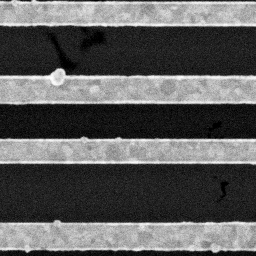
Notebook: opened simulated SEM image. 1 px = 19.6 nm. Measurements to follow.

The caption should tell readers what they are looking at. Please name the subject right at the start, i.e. lines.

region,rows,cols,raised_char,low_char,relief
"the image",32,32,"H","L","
HHHHHHHHHHHHHHHHHHHHHHHHHHHHHHHH
HHHHHHHHHHHHHHHHHHHHHHHHHHHHHHHH
HHHHHHHHHHHHHHHHHHHHHHHHHHHHHHHH
LLLLLLLLLLLLLLLLLLLLLLLLLLLLLLLL
LLLLLLLLLLLLLLLLLLLLLLLLLLLLLLLL
LLLLLLLLLLLLLLLLLLLLLLLLLLLLLLLL
LLLLLLLLLLLLLLLLLLLLLLLLLLLLLLLL
LLLLLLLLLLLLLLLLLLLLLLLLLLLLLLLL
LLLLLLLLLLLLLLLLLLLLLLLLLLLLLLLL
LLLLLLHHLLLLLLLLLLLLLLLLLLLLLLLL
HHHHHHHHHHHHHHHHHHHHHHHHHHHHHHHH
HHHHHHHHHHHHHHHHHHHHHHHHHHHHHHHH
HHHHHHHHHHHHHHHHHHHHHHHHHHHHHHHH
LLLLLLLLLLLLLLLLLLLLLLLLLLLLLLLL
LLLLLLLLLLLLLLLLLLLLLLLLLLLLLLLL
LLLLLLLLLLLLLLLLLLLLLLLLLLLLLLLL
LLLLLLLLLLLLLLLLLLLLLLLLLLLLLLLL
HHHHHHHHHHHHHHHHHHHHHHHHHHHHHHHH
HHHHHHHHHHHHHHHHHHHHHHHHHHHHHHHH
HHHHHHHHHHHHHHHHHHHHHHHHHHHHHHHH
LLLLLLLLLLLLLLLLLLLLLLLLLLLLLLLL
LLLLLLLLLLLLLLLLLLLLLLLLLLLLLLLL
LLLLLLLLLLLLLLLLLLLLLLLLLLLLLLLL
LLLLLLLLLLLLLLLLLLLLLLLLLLLLLLLL
LLLLLLLLLLLLLLLLLLLLLLLLLLLLLLLL
LLLLLLLLLLLLLLLLLLLLLLLLLLLLLLLL
LLLLLLLLLLLLLLLLLLLLLLLLLLLLLLLL
LLLLLLLLLLLLLLLLLLLLLLLLLLLLLLLL
HHHHHHHHHHHHHHHHHHHHHHHHHHHHHHHH
HHHHHHHHHHHHHHHHHHHHHHHHHHHHHHHH
HHHHHHHHHHHHHHHHHHHHHHHHHHHHHHHH
LLLLLLLLLLLLLLLLLLLLLLLLLLLLLLLL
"